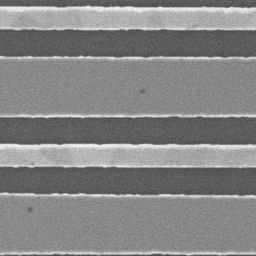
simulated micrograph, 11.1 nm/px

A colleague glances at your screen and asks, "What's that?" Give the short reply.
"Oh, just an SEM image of lines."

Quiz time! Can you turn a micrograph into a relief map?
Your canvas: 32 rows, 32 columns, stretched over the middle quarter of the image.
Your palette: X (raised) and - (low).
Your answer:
XXXXXXXXXXXXXXXXXXXXXXXXXXXXXXXX
XXXXXXXXXXXXXXXXXXXXXXXXXXXXXXXX
XXXXXXXXXXXXXXXXXXXXXXXXXXXXXXXX
XXXXXXXXXXXXXXXXXXXXXXXXXXXXXXXX
XXXXXXXXXXXXXXXXXXXXXXXXXXXXXXXX
XXXXXXXXXXXXXXXXXXXXXXXXXXXXXXXX
XXXXXXXXXXXXXXXXXXXXXXXXXXXXXXXX
XXXXXXXXXXXXXXXXXXXXXXXXXXXXXXXX
XXXXXXXXXXXXXXXXXXXXXXXXXXXXXXXX
XXXXXXXXXXXXXXXXXXXXXXXXXXXXXXXX
XXXXXXXXXXXXXXXXXXXXXXXXXXXXXXXX
XXXXXXXXXXXXXXXXXXXXXXXXXXXXXXXX
XXXXXXXXXXXXXXXXXXXXXXXXXXXXXXXX
--------------------------------
--------------------------------
--------------------------------
--------------------------------
--------------------------------
--------------------------------
--------------------------------
XXXXXXXX--XXXXX-----XX-----X----
XXXXXXXXXXXXXXXXXXXXXXXXXXXXXXXX
XXXXXXXXXXXXXXXXXXXXXXXXXXXXXXXX
XXXXXXXXXXXXXXXXXXXXXXXXXXXXXXXX
XXXXXXXXXXXXXXXXXXXXXXXXXXXXXXXX
XX-XX--------XXXXXXXXXXXXXXXXXXX
--------------------------------
--------------------------------
--------------------------------
--------------------------------
--------------------------------
--------------------------------